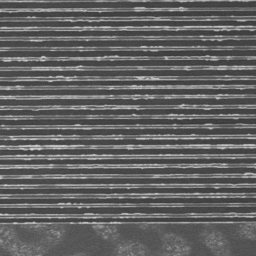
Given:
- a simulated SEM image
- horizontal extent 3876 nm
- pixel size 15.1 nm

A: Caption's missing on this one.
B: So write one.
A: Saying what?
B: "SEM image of parallel lines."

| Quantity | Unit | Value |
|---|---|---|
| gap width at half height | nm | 92.7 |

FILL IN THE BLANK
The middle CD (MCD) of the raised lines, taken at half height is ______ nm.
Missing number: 53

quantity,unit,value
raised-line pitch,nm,148